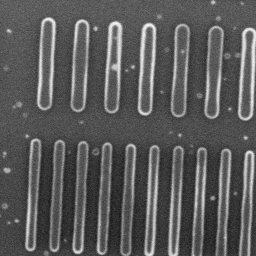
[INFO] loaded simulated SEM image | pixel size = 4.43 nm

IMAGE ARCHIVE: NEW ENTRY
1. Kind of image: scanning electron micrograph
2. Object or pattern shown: groups of lines, slits or small figures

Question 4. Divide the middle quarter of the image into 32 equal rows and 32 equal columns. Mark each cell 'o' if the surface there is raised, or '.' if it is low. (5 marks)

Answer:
..oooo.....ooo......oo......ooo.
..oooo.....ooo.....ooo......ooo.
..ooo......ooo.....ooo......ooo.
..ooo......ooo.....ooo......oo..
..ooo......ooo.....ooo.....ooo..
..ooo.....oooo.....ooo.....ooo..
..ooo.....oooo.....ooo.....ooo..
..ooo.....oooo.....ooo.....ooo..
..ooo.....oooo.....ooo.....ooo..
..ooo.....oooo.....ooo.....ooo..
..ooo.....ooo......ooo.....ooo..
..ooo.....ooo......ooo.....ooo..
....................o......ooo..
................................
................................
................................
................................
................................
................................
....o...........................
....oo....oo....o...............
....oo....oo....oo....oo....oo..
...ooo....oo....oo....oo...ooo..
...ooo....oo....oo....oo...ooo..
...ooo....oo...oo.....oo...oo...
...ooo....oo...oo.....o....oo...
...oo....ooo...oo.....o....oo...
...oo....ooo...oo.....o....oo...
...oo....ooo...oo....oo....oo...
...oo....oo....oo....oo....oo...
...oo....oo....oo....oo....oo...
...oo....oo....oo....oo....oo...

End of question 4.